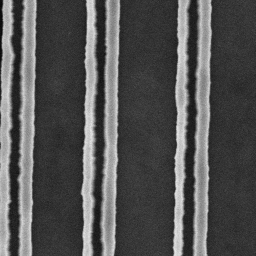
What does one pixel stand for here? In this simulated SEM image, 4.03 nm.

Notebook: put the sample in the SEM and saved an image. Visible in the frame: lines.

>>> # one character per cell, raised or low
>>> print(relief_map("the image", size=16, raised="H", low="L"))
HHLLLHHLLLLHHLLL
HHLLLHHLLLLHHLLL
HHLLLHHLLLLHHLLL
HHLLLHHLLLLHHLLL
HHLLLHHLLLLHHLLL
HHLLLHHLLLLHHLLL
HHLLLHHLLLLHHLLL
HHLLLHHLLLLHHLLL
HHLLLHHLLLLHHLLL
HHLLLHHLLLLHHLLL
HHLLLHHLLLLHHLLL
HHLLLHHLLLLHHLLL
HHLLLHHLLLLHHLLL
HHLLLHHLLLLHHLLL
HHLLLHHLLLLHHLLL
HHLLLHHLLLLHHLLL